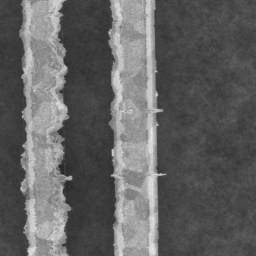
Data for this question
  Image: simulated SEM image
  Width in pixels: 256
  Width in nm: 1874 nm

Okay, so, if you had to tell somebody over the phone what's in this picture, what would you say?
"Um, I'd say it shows one or a few lines or trenches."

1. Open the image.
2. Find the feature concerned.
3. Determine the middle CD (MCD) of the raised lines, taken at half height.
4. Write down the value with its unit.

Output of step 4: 217 nm